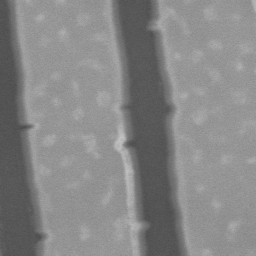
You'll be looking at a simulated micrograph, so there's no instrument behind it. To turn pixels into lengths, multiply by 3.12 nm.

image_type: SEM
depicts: one or a few lines or trenches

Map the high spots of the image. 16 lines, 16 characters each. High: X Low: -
-XXXXXX---XXXXXX
-XXXXXX---XXXXXX
-XXXXXX---XXXXXX
-XXXXXXX--XXXXXX
-XXXXXXX--XXXXXX
-XXXXXXX---XXXXX
-XXXXXXX---XXXXX
--XXXXXX---XXXXX
--XXXXXX---XXXXX
--XXXXXX---XXXXX
--XXXXXX---XXXXX
--XXXXXX---XXXXX
--XXXXXXX--XXXXX
--XXXXXXX--XXXXX
---XXXXXX--XXXXX
---XXXXXX---XXXX